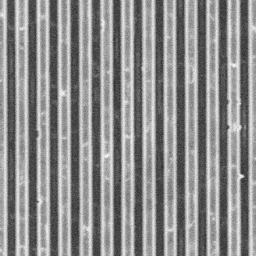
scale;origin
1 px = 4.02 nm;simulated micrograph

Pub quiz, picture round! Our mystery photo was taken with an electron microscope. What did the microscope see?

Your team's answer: parallel lines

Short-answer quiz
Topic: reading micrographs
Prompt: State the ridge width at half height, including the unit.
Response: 43.2 nm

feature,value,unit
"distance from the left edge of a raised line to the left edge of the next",0.0851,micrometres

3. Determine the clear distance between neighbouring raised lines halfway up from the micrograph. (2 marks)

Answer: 43.2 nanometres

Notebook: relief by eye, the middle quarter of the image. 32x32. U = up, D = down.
UDDDUUUDDDUUDDDUUDDDUUDDDUUUDDDU
UDDDUUUDDDUUDDDUUDDDUUDDDUUUDDDU
UDDDUUUDDDUUDDDUUDDDUUDDDUUUDDDU
UDDDUUUDDDUUDDDUUDDDUUDDDUUUDDDU
UDDDUUUDDDUUDDDUUDDDUUDDDUUUDDDU
UDDDUUUDDDUUDDDUUDDDUUDDDUUUDDDU
UDDDUUUDDDUUDDDUUDDDUUDDDUUUDDDU
UDDDUUUDDDUUDDDUUDDDUUDDDUUUDDDU
UDDDUUUDDDUUDDDUUDDDUUDDDUUUDDDU
UDDDUUUDDDUUDDDUUDDDUUDDDUUUDDDU
UDDDUUUDDDUUDDDUUDDDUUDDDUUUDDDU
UDDDUUDDDDUUDDDUUDDDUUDDDUUUDDDU
UDDDUUUDDDUUDDDUUDDDUUDDDUUUDDDU
UDDDUUUDDDUUDDDUUDDDUUDDDUUUDDDU
UDDDUUUDDDUUDDDUUDDDUUDDDUUUDDDU
UDDDUUUDDDUUDDDUUDDDUUDDDUUUDDDU
UDDDUUUDDDUUDDDUUDDDUUDDDUUUDDDU
UDDDUUUDDDUUDDDUUDDDUUDDDUUUDDDU
UDDDUUUDDDUUDDDUUDDDUUUDDUUUDDDU
UDDDUUUDDDUUDDDUUDDDUUUDDUUUDDDU
UDDDUUUDDDUUDDDUUDDDUUUDDUUUDDDU
UDDDUUUDDDUUDDDUUDDDUUUDDUUUDDDU
UDDDUUUDDDUUDDDUUDDDUUUDDUUUDDDU
UDDDUUUDDDUUDDDUUDDDUUUDDUUUDDDU
UDDDUUUDDDUUDDDUUDDDUUUDDUUUDDDU
UDDDUUUDDDUUDDDUUDDDUUUDDUUUDDDU
UDDDUUUDDDUUDDDUUDDDUUUDDUUUDDDU
UDDDUUUDDDUUDDDUUDDDUUUDDUUUDDDU
UDDDUUUDDDUUDDDUUDDDUUUDDUUUDDDU
UDDDUUUDDDUUDDDUUDDDUUUDDUUUDDDU
UDDDUUUDDDUUDDDUUDDDUUUDDUUUDDDU
UDDDUUUDDDUUDDDUUDDDUUUDDUUUDDDU